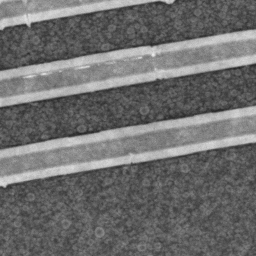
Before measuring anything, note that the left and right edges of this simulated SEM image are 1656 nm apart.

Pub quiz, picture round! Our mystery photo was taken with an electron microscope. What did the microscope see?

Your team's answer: one or a few lines or trenches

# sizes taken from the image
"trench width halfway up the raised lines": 51.4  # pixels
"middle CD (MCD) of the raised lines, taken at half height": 0.172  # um